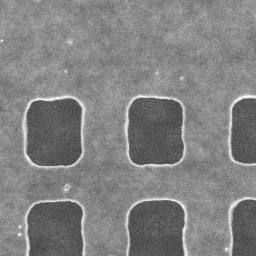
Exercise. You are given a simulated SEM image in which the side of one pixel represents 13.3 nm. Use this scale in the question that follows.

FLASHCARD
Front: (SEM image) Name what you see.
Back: holes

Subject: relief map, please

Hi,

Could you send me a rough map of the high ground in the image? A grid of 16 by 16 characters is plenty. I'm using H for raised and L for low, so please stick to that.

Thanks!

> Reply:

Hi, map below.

HHHHHHHHHHHHHHHH
HHHHHHHHHHHHHHHH
HHHHHHHHHHHHHHHH
HHHHHHHHHHHHHHHH
HHHHHHHHHHHHHHHH
HHHHHHHHHHHHHHHH
HHLLLHHHLLLHHHHL
HHLLLHHHLLLHHHLL
HHLLLHHHLLLHHHLL
HHLLLHHHLLLHHHLL
HHHHHHHHHHHHHHHH
HHHHHHHHHHHHHHHH
HHHHHHHHHHHHHHHL
HHLLLHHHLLLHHHLL
HHLLLHHHLLLHHHLL
HHLLLHHHLLLHHHLL